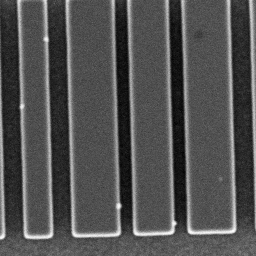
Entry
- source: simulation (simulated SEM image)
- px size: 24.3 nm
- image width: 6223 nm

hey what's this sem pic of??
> groups of lines, slits or small figures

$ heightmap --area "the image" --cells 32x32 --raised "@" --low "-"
--@@@@--@@@@@@--@@@@@--@@@@@@--@
--@@@@--@@@@@@--@@@@@--@@@@@@--@
--@@@@--@@@@@@--@@@@@--@@@@@@--@
--@@@@--@@@@@@--@@@@@--@@@@@@--@
--@@@@--@@@@@@--@@@@@--@@@@@@--@
--@@@@---@@@@@--@@@@@--@@@@@@--@
---@@@---@@@@@--@@@@@--@@@@@@--@
---@@@---@@@@@--@@@@@--@@@@@@---
---@@@---@@@@@--@@@@@--@@@@@@---
---@@@---@@@@@--@@@@@--@@@@@@---
---@@@---@@@@@--@@@@@--@@@@@@---
---@@@---@@@@@--@@@@@--@@@@@@---
---@@@---@@@@@--@@@@@--@@@@@@---
---@@@---@@@@@--@@@@@--@@@@@@---
---@@@---@@@@@@-@@@@@--@@@@@@---
---@@@---@@@@@@-@@@@@--@@@@@@---
---@@@---@@@@@@-@@@@@--@@@@@@---
---@@@---@@@@@@-@@@@@--@@@@@@---
---@@@---@@@@@@-@@@@@--@@@@@@---
---@@@---@@@@@@-@@@@@--@@@@@@---
---@@@---@@@@@@--@@@@--@@@@@@---
---@@@---@@@@@@--@@@@@-@@@@@@---
---@@@---@@@@@@--@@@@@-@@@@@@---
---@@@---@@@@@@--@@@@@-@@@@@@---
---@@@---@@@@@@--@@@@@-@@@@@@---
---@@@---@@@@@@--@@@@@-@@@@@@---
---@@@---@@@@@@--@@@@@-@@@@@@---
---@@@---@@@@@@--@@@@@-@@@@@@---
---@@@@--@@@@@@--@@@@@--@@@@@---
---@@@--------------------------
--------------------------------
--------------------------------